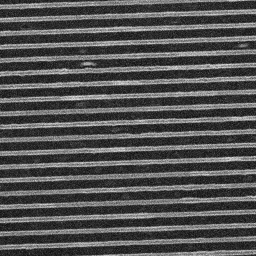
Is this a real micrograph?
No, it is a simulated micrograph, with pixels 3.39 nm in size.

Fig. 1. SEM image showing parallel lines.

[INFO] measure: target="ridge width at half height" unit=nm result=14.4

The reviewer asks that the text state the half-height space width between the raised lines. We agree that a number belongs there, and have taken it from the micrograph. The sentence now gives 31.4 nm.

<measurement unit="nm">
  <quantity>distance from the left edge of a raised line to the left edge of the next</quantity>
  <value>45.3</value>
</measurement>